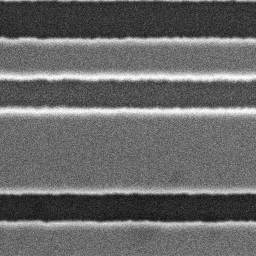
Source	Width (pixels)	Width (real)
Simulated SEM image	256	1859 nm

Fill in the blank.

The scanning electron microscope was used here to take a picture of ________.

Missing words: lines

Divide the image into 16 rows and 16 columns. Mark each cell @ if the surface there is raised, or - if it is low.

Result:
----------------
----------------
@@@@@@@@@@@@@@@@
@@@@@@@@@@@@@@@@
@@@@@@@@@@@@@@@@
@@@@@@@@@@@@@@@@
@@@@@@@@@@@@@@@@
@@@@@@@@@@@@@@@@
@@@@@@@@@@@@@@@@
@@@@@@@@@@@@@@@@
@@@@@@@@@@@@@@@@
@@@@@@@@@@@@@@@@
----------------
----------------
@@@@@@@@@@@@@@@@
@@@@@@@@@@@@@@@@